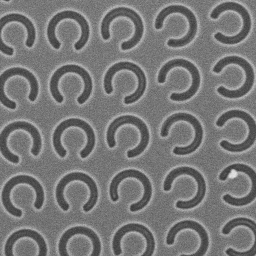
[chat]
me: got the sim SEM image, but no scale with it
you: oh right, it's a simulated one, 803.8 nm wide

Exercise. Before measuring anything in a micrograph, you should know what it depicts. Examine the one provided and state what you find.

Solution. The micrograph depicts an array of small figures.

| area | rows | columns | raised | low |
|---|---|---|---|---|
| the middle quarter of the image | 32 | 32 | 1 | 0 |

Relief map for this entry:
00001111111100000011111110000000
00000111111000000000111100111110
11100011110001111100111100111111
11110001110011111100011000111111
11111001110011111100011101111111
11111001110011111100011111111111
11111001110011111100111111111110
11110001111111111000111111100000
11100011111111100001111111000000
11100111111111100011111111111111
11111111111111111111111111111111
11111111111111111111111111111111
11111111111111111111111111100001
10011111111110000001111111000000
00000011111100000000111110001110
00000001111000111100011100011111
11111001111001111110011100111111
11111000110001111110011100111111
11111100110001111110011111111111
11111100111001111110011111111111
11111000111001111100011111111110
01111001111111110000111111100000
01110011111111110001111111110001
11111111111111110111111111111111
11111111111111111111111111111111
11111111111111111111111111111111
11111111111111100011111111100000
10000011111110000000111111000000
00000001111100000000011110001111
00111000111100111110001110011111
01111100111000111111001110011111
11111100111001111111001110011111